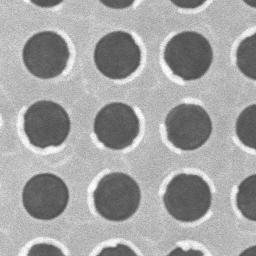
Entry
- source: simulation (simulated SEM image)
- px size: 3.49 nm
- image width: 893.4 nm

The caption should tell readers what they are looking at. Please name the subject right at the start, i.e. a regular array of holes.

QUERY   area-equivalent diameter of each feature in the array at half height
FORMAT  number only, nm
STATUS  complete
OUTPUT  165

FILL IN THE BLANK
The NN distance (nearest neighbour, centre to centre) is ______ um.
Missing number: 0.246